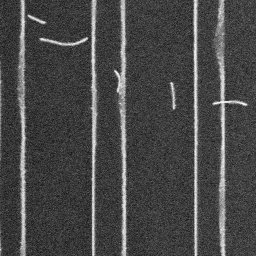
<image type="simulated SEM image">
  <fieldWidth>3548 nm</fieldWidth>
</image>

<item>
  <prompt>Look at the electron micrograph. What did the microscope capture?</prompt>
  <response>lines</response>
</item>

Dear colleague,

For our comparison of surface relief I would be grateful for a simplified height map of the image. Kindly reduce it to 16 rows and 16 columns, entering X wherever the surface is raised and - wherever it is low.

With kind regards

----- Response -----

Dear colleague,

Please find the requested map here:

X-----XX----XX--
X-----XX----XX--
X-----XX----XX--
X-----XX----XX--
X-----XX----XX--
X-----XX----XX--
X-----XX----XX--
X-----XX----XX--
X-----XX----XX--
X-----XX----XX--
X-----XX----XX--
X-----XX----XX--
X-----XX----XX--
X-----XX----XX--
X-----XX----XX--
X-----XX----XX--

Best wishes